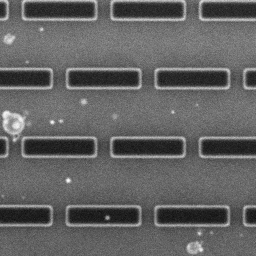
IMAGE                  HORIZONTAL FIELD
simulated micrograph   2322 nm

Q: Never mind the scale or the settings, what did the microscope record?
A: groups of lines, slits or small figures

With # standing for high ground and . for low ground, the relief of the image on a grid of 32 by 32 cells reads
#..#########..#########..#######
#..#########..#########..#######
................................
................................
................................
................................
................................
................................
................................
######..##########.##########..#
######..##########.##########..#
................................
................................
................................
................................
................................
................................
#..#########..#########..#######
#..#########..#########..#######
#..#########..#########..#######
................................
................................
................................
................................
................................
................................
######..##########.##########.##
######..##########.##########.##
................................
................................
................................
................................